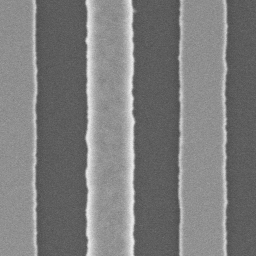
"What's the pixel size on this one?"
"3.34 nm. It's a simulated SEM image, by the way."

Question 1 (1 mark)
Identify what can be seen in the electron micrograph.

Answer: lines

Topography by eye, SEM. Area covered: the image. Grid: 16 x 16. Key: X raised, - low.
XX---XXX---XXX--
XX---XXX---XXX--
XX---XXX---XXX--
XX---XXX---XXX--
XX---XXX---XXX--
XX---XXX---XXX--
XX---XXX---XXX--
XX---XXX---XXX--
XX---XXX---XXX--
XX---XXX---XXX--
XX---XXX---XXX--
XX---XXX---XXX--
XX---XXX---XXX--
XX---XXX---XXX--
XX---XXX---XXX--
XX---XXX---XXX--